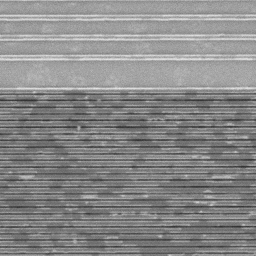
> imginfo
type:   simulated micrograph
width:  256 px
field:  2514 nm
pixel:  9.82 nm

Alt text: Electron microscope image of parallel lines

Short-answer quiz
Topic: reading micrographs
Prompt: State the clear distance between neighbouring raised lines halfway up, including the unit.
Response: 17.2 nanometers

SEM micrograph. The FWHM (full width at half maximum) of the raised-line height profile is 50.3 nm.